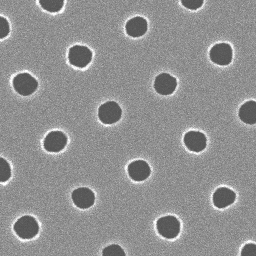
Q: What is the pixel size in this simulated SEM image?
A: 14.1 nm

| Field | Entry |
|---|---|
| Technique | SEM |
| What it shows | a regular array of holes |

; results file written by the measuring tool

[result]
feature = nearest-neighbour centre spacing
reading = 0.879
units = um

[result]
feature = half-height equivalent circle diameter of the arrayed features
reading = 324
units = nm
